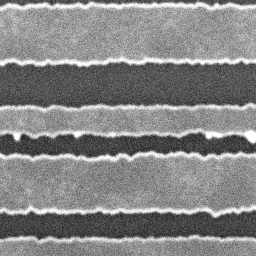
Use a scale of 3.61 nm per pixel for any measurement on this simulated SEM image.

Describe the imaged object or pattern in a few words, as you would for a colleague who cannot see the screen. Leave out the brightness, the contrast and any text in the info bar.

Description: lines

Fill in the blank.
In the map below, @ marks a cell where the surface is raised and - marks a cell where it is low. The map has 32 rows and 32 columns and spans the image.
-----@-----@----@--@@@@---------
@@@@@@@@@@@@@@@@@@@@@@@@@@@@@@@@
@@@@@@@@@@@@@@@@@@@@@@@@@@@@@@@@
@@@@@@@@@@@@@@@@@@@@@@@@@@@@@@@@
@@@@@@@@@@@@@@@@@@@@@@@@@@@@@@@@
@@@@@@@@@@@@@@@@@@@@@@@@@@@@@@@@
@@@@@@@@@@@@@@@@@@@@@@@@@@@@@@@@
@@@@@@@@@@@@@@@@@@@@@@@@@@@@@@@@
--------------------------------
--------------------------------
--------------------------------
--------------------------------
--------------------------------
@@@@@-@@--@@@@@@@@@@@@@@@@@@@@@@
@@@@@@@@@@@@@@@@@@@@@@@@@@@@@@@@
@@@@@@@@@@@@@@@@@@@@@@@@@@@@@@@@
@@@@@@@@@@@@@@@@@@@@@@@@-@@@@@@@
-------------------------------@
--------------------------------
@@@@-@-@@------@-@@@@@@@@-@@@@@@
@@@@@@@@@@@@@@@@@@@@@@@@@@@@@@@@
@@@@@@@@@@@@@@@@@@@@@@@@@@@@@@@@
@@@@@@@@@@@@@@@@@@@@@@@@@@@@@@@@
@@@@@@@@@@@@@@@@@@@@@@@@@@@@@@@@
@@@@@@@@@@@@@@@@@@@@@@@@@@@@@@@@
@@@@@@@@@@@@@@@@@@@@@@@@@@@@@@@@
-@@@@@-@@@@@-@@-@---@-@@--@@@---
--------------------------------
--------------------------------
------------------------@-------
@@@@@@@@@@@@@@@@@@@@@@@@@@@@@@@@
@@@@@@@@@@@@@@@@@@@@@@@@@@@@@@@@